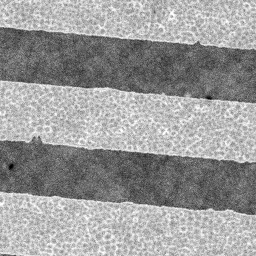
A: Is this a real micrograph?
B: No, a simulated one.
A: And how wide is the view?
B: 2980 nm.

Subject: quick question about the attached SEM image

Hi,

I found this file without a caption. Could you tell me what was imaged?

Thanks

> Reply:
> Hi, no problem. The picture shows one or a few lines or trenches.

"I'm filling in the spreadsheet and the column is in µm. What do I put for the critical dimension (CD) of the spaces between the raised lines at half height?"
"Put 0.62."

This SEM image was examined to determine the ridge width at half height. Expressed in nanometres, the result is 638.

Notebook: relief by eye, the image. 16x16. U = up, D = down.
UUUUUUUUUUUUUUUU
UUUUUUUUUUUUUUUU
DDDDDDDDDUUUUUUU
DDDDDDDDDDDDDDDD
DDDDDDDDDDDDDDDD
UUUUUDDDDDDDDDDD
UUUUUUUUUUUUUUUU
UUUUUUUUUUUUUUUU
UUUUUUUUUUUUUUUU
DDDDDDDDDUUUUUUU
DDDDDDDDDDDDDDDD
DDDDDDDDDDDDDDDD
UUUUUDDDDDDDDDDD
UUUUUUUUUUUUUUUU
UUUUUUUUUUUUUUUU
UUUUUUUUUUUUUUUU